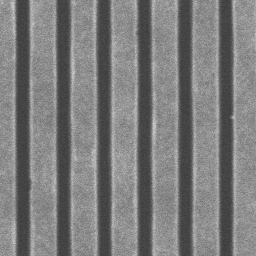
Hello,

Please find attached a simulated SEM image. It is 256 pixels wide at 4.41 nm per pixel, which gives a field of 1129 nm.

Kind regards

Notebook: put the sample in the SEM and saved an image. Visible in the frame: parallel lines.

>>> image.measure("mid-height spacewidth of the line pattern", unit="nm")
56.8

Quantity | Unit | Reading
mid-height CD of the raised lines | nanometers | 121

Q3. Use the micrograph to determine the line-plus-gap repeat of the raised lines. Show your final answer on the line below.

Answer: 179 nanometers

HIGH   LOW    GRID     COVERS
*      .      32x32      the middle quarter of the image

..******....*******...******....
..******....*******...*******...
..******....*******...*******...
..******....*******...*******...
..******....*******...*******...
..******....*******...*******...
..******....*******...*******...
..******....*******...*******...
..******....******....*******...
..******....******....*******...
..******....******....*******...
.*******....******....*******...
.*******....******....*******...
..******....******....*******...
..******....******....*******...
..******....******....*******...
..******....******....*******...
..******....******....*******...
..******....******....*******...
..*******...******....******....
..*******...******....******....
..******....******....******....
..******....******....******....
..******....******....******....
..******....******....*******...
..******....******....*******...
..******....******....*******...
..******....******....*******...
..******....******....*******...
..******....******....*******...
..******....******....*******...
..******....******....*******...